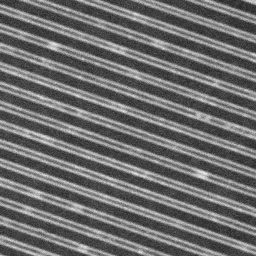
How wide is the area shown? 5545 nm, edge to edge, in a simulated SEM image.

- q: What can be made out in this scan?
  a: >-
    parallel lines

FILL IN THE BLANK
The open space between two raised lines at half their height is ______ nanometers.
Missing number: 251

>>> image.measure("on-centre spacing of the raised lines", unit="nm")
394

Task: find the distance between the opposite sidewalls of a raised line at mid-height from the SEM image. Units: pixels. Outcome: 6.73